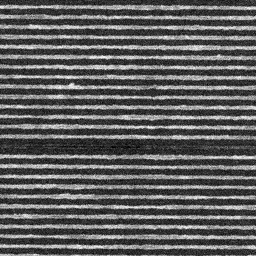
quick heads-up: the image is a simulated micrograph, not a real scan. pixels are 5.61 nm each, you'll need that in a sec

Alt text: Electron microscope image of parallel lines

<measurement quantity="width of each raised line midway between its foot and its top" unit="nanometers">15.4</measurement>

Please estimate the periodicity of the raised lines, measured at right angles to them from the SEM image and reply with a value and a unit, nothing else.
56 nm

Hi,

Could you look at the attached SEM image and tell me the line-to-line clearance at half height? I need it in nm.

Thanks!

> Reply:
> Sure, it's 42.1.